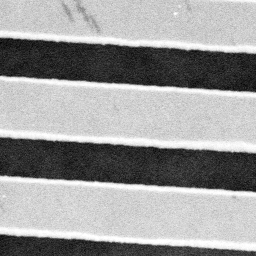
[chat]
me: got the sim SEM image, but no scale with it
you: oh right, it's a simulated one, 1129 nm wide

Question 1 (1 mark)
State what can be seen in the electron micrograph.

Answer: lines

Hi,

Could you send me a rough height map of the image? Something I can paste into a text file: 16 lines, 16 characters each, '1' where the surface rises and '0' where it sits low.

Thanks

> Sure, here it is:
1111111111111111
1111111111111111
0001111111111111
0000000000000000
0000000000000000
1111111111100000
1111111111111111
1111111111111111
1111111111111111
0000000000000000
0000000000000000
1111111100000000
1111111111111111
1111111111111111
1111111111111111
0000000000000011